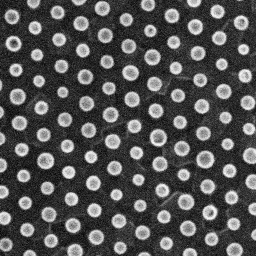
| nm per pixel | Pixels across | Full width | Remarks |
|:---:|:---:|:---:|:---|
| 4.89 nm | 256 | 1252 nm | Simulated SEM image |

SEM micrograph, a regular array of raised bodies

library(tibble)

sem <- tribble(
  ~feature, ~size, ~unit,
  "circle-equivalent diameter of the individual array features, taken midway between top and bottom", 61.1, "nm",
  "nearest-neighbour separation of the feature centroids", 0.127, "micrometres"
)